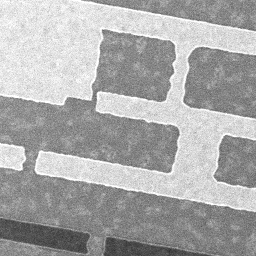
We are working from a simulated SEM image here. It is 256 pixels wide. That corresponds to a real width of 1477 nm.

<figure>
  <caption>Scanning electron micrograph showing one or a few lines or trenches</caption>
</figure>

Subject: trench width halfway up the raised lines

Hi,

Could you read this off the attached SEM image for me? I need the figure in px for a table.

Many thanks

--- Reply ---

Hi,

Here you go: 49.7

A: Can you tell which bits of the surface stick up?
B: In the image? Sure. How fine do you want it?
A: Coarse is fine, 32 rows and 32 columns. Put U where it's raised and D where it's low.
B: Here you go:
UUUUUUUUUUUUDDDDDDDDDDDDDDDDDDDD
UUUUUUUUUUUUUUUUUUDDDDDDDDDDDDDD
UUUUUUUUUUUUUUUUUUUUUUUUDDDDDDDD
UUUUUUUUUUUUUUUUUUUUUUUUUUUUUDDD
UUUUUUUUUUUUUDDDDDUUUUUUUUUUUUUU
UUUUUUUUUUUUDDDDDDDDDDUUUUUUUUUU
UUUUUUUUUUUUDDDDDDDDDDUUDDDDDUUU
UUUUUUUUUUUUDDDDDDDDDDUDDDDDDDDD
UUUUUUUUUUUUDDDDDDDDDDUUDDDDDDDD
UUUUUUUUUUUUDDDDDDDDDDUDDDDDDDDD
UUUUUUUUUUUUDDDDDDDDDUUDDDDDDDDD
UUUUUUUUUUUDDDDDDDDDDUUDDDDDDDDD
DDDDUUUUDDDDUUUUUUDDDUUDDDDDDDDD
DDDDDDDDDDDDUUUUUUUUUUUUDDDDDDDD
DDDDDDDDDDDDDDDUUUUUUUUUUUUUUUDD
DDDDDDDDDDDDDDDDDDDDDUUUUUUUUUUU
DDDDDDDDDDDDDDDDDDDDDDUUUUUUUUUU
DDDDDDDDDDDDDDDDDDDDDDUUUUUUDDDD
UUUDDDDDDDDDDDDDDDDDDDUUUUUDDDDD
UUUDDUUUUDDDDDDDDDDDDDUUUUUDDDDD
UUUDDUUUUUUUUUDDDDDDDDUUUUUDDDDD
DDDDDUUUUUUUUUUUUUUUDUUUUUUDDDDD
DDDDDDDDDUUUUUUUUUUUUUUUUUUDDDDD
DDDDDDDDDDDDDDDUUUUUUUUUUUUUUUUD
DDDDDDDDDDDDDDDDDDDDDUUUUUUUUUUU
DDDDDDDDDDDDDDDDDDDDDDDDDDUUUUUU
DDDDDDDDDDDDDDDDDDDDDDDDDDDDDDDD
UUDDDDDDDDDDDDDDDDDDDDDDDDDDDDDD
UUUUUUUUDDDDDDDDDDDDDDDDDDDDDDDD
UUUUUUUUUUUDDDDDDDDDDDDDDDDDDDDD
DDDUUUUUUUUDDUUUUUUDDDDDDDDDDDDD
DDDDDDDDDUUDDUUUUUUUUUUUUDDDDDDD